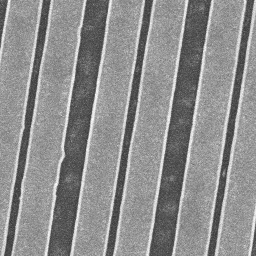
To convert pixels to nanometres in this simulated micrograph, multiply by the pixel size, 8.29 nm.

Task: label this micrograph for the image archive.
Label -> parallel lines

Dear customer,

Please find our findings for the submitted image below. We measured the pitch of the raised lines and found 430 nm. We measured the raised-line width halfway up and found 271 nm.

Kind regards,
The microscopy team